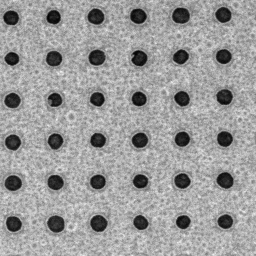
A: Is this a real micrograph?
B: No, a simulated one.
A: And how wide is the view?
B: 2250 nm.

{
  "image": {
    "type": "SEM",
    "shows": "a regular array of holes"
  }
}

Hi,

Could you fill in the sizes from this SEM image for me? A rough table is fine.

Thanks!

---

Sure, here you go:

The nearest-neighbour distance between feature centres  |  0.36 microns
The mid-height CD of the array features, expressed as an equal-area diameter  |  142 nanometres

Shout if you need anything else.